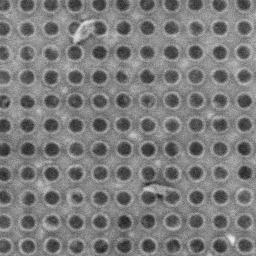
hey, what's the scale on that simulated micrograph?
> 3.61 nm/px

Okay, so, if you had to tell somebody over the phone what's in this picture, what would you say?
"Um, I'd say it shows a regular array of raised bodies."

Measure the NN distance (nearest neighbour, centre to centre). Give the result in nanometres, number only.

85.9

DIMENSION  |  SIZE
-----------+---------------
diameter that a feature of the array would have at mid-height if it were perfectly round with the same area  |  62.3 nm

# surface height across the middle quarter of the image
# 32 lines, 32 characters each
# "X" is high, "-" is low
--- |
--------------------------------
--XX----XX---XXX----XX----XX---X
-XXXX--XXXX--XXXX--XXXX--XXXX--X
-XXXX--XXXX--XXXX--XXXX--XXXX--X
-XXXX--XXXX--XXXX--XXXX--XXX---X
--------------------------------
--------------------------------
--XX----XX----XX----XX----XX----
-XXXX--XXXX--XXXX--XXXX--XXXX--X
-XXXX--XXXX--XXXX--XXXX--XXXX--X
-XXXX--XXXX--XXXX--XXXX---XXX---
--------------------------------
--------------------------------
--XX----XX----XX----XX----XX----
-XXXX--XXXX--XXXX--XXXX--XXXX--X
-XXXX--XXXX--XXXX--XXXX--XXXX--X
-XXXX--XXXX--XXX---XXXX--XXXX--X
--------------------------------
--------------------------------
--XX----------XX----XX----XX----
-XXXX--XXXX--XXXX--XXXX--XXXX--X
-XXXX--XXXX--XXXX--XXXX--XXXX--X
-XXXX--XXXX--XXXX--XXXX--XXXX--X
--------------------XX----------
--------------------------------
--XX----XX----XX----XX----XX----
-XXXX--XXXX--XXXX--XXXX--XXXX--X
-XXXX--XXXX--XXXX--XXXX--XXXX--X
-XXXX--XXXX--XXXX--XXXX--XXXX--X
--------------------------------
---------------------XXXX-------
--XX----------------XXXXXXXX----